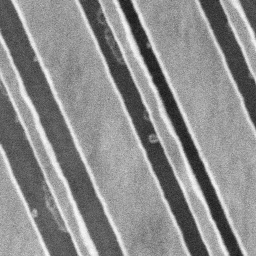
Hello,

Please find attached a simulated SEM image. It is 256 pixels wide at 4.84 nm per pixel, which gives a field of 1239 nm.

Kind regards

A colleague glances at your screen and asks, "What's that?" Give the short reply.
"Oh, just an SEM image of lines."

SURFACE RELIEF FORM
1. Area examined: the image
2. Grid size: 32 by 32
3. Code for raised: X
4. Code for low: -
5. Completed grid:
--XXXXXXXX---XX--XXXXXXXX---XX--
--XXXXXXXX---XX--XXXXXXXX---XX--
---XXXXXXXX--XXX-XXXXXXXXX---XX-
---XXXXXXXX---XX--XXXXXXXX---XX-
----XXXXXXXX--XX--XXXXXXXXX--XXX
X---XXXXXXXX---XX--XXXXXXXX---XX
X---XXXXXXXXX--XX--XXXXXXXXX--XX
XX---XXXXXXXX---XX--XXXXXXXX---X
XX---XXXXXXXX---XX--XXXXXXXX---X
XX----XXXXXXXX--XXX--XXXXXXXX---
XXX---XXXXXXXX---XX--XXXXXXXX---
-XX----XXXXXXXX--XXX-XXXXXXXXX--
-XXX---XXXXXXXX---XX--XXXXXXXX--
--XX---XXXXXXXXX--XX--XXXXXXXXX-
--XXX---XXXXXXXX---XX--XXXXXXXX-
---XX---XXXXXXXXX--XX--XXXXXXXXX
---XX----XXXXXXXX--XXX--XXXXXXXX
----XX---XXXXXXXX---XX--XXXXXXXX
----XX----XXXXXXXX--XXX--XXXXXXX
X---XXX---XXXXXXXX---XX--XXXXXXX
X----XX----XXXXXXXX--XXX-XXXXXXX
X----XXX---XXXXXXXX---XX--XXXXXX
XX----XX---XXXXXXXXX--XX--XXXXXX
XX----XXX---XXXXXXXX---XX--XXXXX
XXX----XX---XXXXXXXX---XX--XXXXX
XXX----XX----XXXXXXXX--XXX--XXXX
XXXX----XX---XXXXXXXX---XX--XXXX
XXXX----XX----XXXXXXXX--XXX-XXXX
XXXXX---XXX---XXXXXXXX---XX--XXX
XXXXX----XX----XXXXXXXX--XXX-XXX
XXXXX----XXX---XXXXXXXX---XX--XX
XXXXXX----XX---XXXXXXXXX--XX--XX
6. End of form